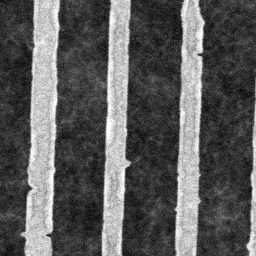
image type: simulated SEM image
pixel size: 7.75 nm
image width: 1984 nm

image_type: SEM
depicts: one or a few lines or trenches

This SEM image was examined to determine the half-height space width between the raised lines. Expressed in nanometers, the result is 418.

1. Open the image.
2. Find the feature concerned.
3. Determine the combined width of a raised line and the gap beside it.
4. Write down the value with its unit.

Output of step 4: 0.568 um